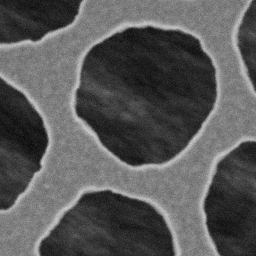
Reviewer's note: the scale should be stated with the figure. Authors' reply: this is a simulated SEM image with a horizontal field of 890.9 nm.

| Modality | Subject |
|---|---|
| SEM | holes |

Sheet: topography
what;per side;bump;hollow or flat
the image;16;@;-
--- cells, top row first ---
-----@@@@@@@@@@-
----@@@@@@@@@@@-
--@@@@@-----@@@-
@@@@@--------@@-
@@@@@--------@@-
-@@@@---------@@
--@@@--------@@@
---@@--------@@@
---@@@------@@@@
---@@@@----@@@--
--@@@@@@@@@@@---
--@@@@@@@@@@@---
-@@@@----@@@@---
@@@@------@@@---
@@@--------@@---
@@---------@@---